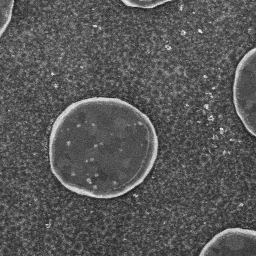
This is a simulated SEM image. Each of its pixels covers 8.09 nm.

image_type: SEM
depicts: raised bodies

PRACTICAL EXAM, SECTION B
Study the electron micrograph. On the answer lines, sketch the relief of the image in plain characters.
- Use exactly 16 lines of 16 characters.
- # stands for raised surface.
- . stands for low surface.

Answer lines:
#...............
................
................
...............#
...............#
...............#
.....###.......#
....#####......#
...#######......
...#######......
...######.......
....#####.......
................
................
..............##
.............###